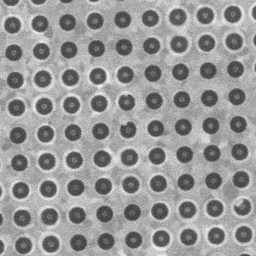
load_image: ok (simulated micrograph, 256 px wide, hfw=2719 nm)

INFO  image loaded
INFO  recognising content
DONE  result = an array of small figures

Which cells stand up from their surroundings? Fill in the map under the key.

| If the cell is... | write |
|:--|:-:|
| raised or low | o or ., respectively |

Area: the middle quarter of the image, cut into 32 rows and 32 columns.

ooooooooooooooo.ooooo...ooo....o
...oooo...ooo....ooo....ooo....o
....oo.....oo.....oo....ooo....o
....oo.....oo....ooo....ooo....o
....oo.....oo....ooooo.ooooooooo
...ooooo..oooooooooooooooooooooo
oooooooooooooooooooooooooooooooo
oooooooo..oooo...oooo...oooo...o
....ooo....oo.....ooo....oo.....
....oo.....oo.....oo.....oo.....
....oo.....ooo....ooo...oooo...o
....ooo....ooo...ooooo.ooooooooo
o..ooooooooooooooooooooooooooooo
oooooooooooooooooooooooooooooooo
ooooooooooooooo..oooo....ooo....
o...ooo....ooo....ooo....ooo....
....ooo.....oo....ooo....ooo....
.....oo....ooo....ooo....oooo..o
....oooo...oooo..ooooooooooooooo
oooooooooooooooooooooooooooooooo
oooooooooooooooooooooooooooooo.o
ooooooooo..ooo....ooo....ooo....
....oooo....oo.....oo.....oo....
.....oo.....o......oo.....oo....
.....oo.....oo.....oo....oooo...
....oooo....oo....oooooooooooooo
oo.ooooooooooooooooooooooooooooo
ooooooooooooooooooooooo.oooooo..
oo.oooooo..oooo...oooo...ooo....
o....ooo....oo.....oo.....oo....
o....ooo....oo.....oo.....oo....
o....ooo....oo.....ooo...ooooo..